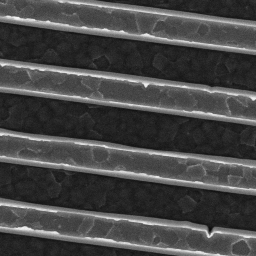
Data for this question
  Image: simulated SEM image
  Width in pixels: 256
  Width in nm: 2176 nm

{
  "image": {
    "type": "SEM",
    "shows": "one or a few lines or trenches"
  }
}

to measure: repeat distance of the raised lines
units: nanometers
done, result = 591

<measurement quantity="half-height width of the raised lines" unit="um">0.239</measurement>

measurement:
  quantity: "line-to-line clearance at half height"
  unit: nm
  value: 348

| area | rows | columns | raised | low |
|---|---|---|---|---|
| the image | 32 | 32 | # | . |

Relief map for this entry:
#############...................
####################............
.############################...
........########################
................################
........................########
...............................#
................................
#######.........................
###############.................
######################..........
...##########################...
..........######################
..................##############
.........................#######
................................
#...............................
#########.......................
################................
########################........
.....##########################.
............####################
...................#############
............................####
................................
###.............................
##########......................
##################..............
#########################.......
......##########################
..............##################
......................##########